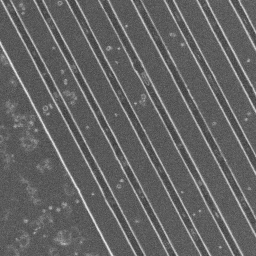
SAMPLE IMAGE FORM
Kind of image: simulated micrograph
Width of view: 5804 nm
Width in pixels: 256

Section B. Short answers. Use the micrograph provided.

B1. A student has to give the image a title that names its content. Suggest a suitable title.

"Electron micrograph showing parallel lines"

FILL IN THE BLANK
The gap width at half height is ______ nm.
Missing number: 178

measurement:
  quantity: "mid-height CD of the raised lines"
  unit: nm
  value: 486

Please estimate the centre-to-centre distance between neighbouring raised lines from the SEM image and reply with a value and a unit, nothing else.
0.654 µm